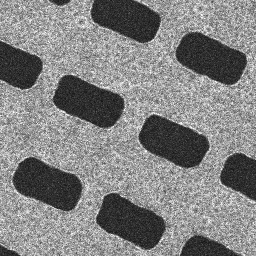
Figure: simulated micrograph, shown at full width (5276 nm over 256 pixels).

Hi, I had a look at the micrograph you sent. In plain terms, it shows holes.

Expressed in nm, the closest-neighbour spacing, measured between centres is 1880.